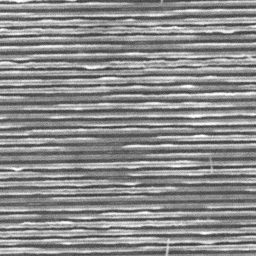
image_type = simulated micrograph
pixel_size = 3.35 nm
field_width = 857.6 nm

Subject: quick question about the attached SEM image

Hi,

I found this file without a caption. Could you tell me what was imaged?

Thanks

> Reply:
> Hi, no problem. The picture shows parallel lines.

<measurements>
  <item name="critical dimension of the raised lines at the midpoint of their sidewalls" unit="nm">15.5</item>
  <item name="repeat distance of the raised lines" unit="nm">28.2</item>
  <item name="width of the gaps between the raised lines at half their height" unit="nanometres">13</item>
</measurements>